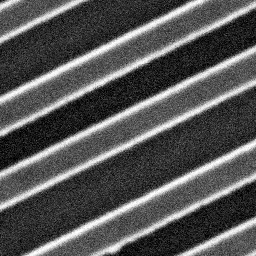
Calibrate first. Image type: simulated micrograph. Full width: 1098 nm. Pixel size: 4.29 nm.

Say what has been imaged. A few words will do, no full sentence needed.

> lines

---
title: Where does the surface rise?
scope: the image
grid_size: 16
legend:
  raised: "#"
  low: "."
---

####.......#####
##.......#####..
.......#####....
.....#####.....#
...#####.....###
.#####.....####.
####.....####...
##.....####.....
.....####.......
...####........#
.####........###
###........####.
#........####...
.......####.....
.....####.....##
...####.....####